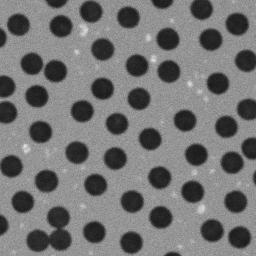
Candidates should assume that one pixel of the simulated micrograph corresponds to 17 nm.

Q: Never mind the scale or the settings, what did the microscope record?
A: a regular array of holes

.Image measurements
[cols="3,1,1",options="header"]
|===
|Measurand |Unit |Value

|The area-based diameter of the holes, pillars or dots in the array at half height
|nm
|390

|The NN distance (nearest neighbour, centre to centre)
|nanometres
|564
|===